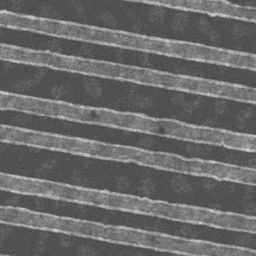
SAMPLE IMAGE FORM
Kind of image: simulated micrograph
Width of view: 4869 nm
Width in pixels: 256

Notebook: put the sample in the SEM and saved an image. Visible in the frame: parallel lines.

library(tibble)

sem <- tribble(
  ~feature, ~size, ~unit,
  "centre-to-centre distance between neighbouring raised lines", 745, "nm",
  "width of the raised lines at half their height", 281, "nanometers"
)